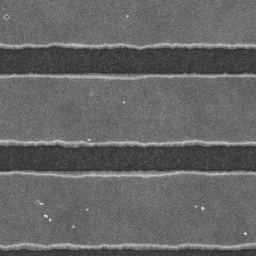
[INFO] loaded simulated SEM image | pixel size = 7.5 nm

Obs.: lines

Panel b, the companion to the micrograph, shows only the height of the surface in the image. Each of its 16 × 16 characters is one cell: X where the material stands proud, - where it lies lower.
XXXXXXXXXXXXXXXX
XXXXXXXXXXXXXXXX
XXXXXXXXXXXXXXXX
----------------
----------------
XXXXXXXXXXXXXXXX
XXXXXXXXXXXXXXXX
XXXXXXXXXXXXXXXX
XXXXXXXXXXXXXXXX
----------------
----------------
XXXXXXXXXXXXXXXX
XXXXXXXXXXXXXXXX
XXXXXXXXXXXXXXXX
XXXXXXXXXXXXXXXX
X-X-------X--XX-